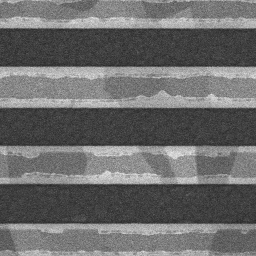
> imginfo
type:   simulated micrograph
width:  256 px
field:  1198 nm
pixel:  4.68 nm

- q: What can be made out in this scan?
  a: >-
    one or a few lines or trenches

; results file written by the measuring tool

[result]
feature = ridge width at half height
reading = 161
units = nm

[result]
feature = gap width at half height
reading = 0.205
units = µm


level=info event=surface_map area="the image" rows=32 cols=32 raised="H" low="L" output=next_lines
HHHHHHHHHHHHHHHHHHHHHHHHHHHHHHHH
HHHHHHHHHHHHHHHHHHHHHHHHHHHHHHHH
HHHHHHHHHHHHHHHHHHHHHHHHHHHHHHHH
LLLLLLLLLLLLLLLLLLLLLLLLLLLLLLLL
LLLLLLLLLLLLLLLLLLLLLLLLLLLLLLLL
LLLLLLLLLLLLLLLLLLLLLLLLLLLLLLLL
LLLLLLLLLLLLLLLLLLLLLLLLLLLLLLLL
LLLLLLLLLLLLLLLLLLLLLLLLLLLLLLLL
LLLLLLLLLLLLLLLLLLLLLLLLLLLLLLLL
HHHHHHHHHHHHHHHHHHHHHHHHHHHHHHHH
HHHHHHHHHHHHHHHHHHHHHHHHHHHHHHHH
HHHHHHHHHHHHHHHHHHHHHHHHHHHHHHHH
HHHHHHHHHHHHHHHHHHHHHHHHHHHHHHHH
LLLLLLLLLLLLLLLLLLLLLLLLLLLLLLLL
LLLLLLLLLLLLLLLLLLLLLLLLLLLLLLLL
LLLLLLLLLLLLLLLLLLLLLLLLLLLLLLLL
LLLLLLLLLLLLLLLLLLLLLLLLLLLLLLLL
LLLLLLLLLLLLLLLLLLLLLLLLLLLLLLLL
LLLLLLLLLLLLLLLLLLLLLLLLLLLLLLLL
HHHHHHHHHHHHHHHHHHHHHHHHHHHHHHHH
HHHHHHHHHHHHHHHHHHHHHHHHHHHHHHHH
HHHHHHHHHHHHHHHHHHHHHHHHHHHHHHHH
HHHHHHHHHHHHHHHHHHHHHHHHHHHHHHHH
LLLLLLLLLLLLLLLLLLLLLLLLLLLLLLLL
LLLLLLLLLLLLLLLLLLLLLLLLLLLLLLLL
LLLLLLLLLLLLLLLLLLLLLLLLLLLLLLLL
LLLLLLLLLLLLLLLLLLLLLLLLLLLLLLLL
LLLLLLLLLLLLLLLLLLLLLLLLLLLLLLLL
HHHHHHHHHHHHHHHHHHHHHHHHHHHHHHHH
HHHHHHHHHHHHHHHHHHHHHHHHHHHHHHHH
HHHHHHHHHHHHHHHHHHHHHHHHHHHHHHHH
HHHHHHHHHHHHHHHHHHHHHHHHHHHHHHHH